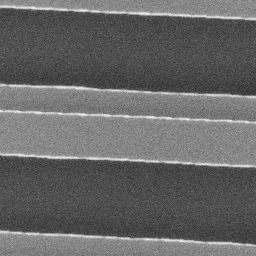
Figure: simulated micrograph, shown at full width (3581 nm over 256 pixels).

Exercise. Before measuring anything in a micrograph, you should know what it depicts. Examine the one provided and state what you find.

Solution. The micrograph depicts lines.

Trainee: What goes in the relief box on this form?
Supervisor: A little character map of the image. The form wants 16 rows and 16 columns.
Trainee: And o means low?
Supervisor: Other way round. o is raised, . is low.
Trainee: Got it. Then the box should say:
.ooooooooooooooo
................
................
................
................
oooo............
oooooooooooooooo
oooooooooooooooo
oooooooooooooooo
oooooooooooooooo
................
................
................
................
................
oooooooooooooooo